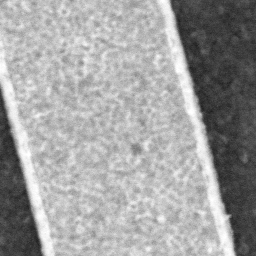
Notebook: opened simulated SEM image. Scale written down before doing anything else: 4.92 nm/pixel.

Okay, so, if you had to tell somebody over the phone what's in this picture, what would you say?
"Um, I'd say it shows one or a few lines or trenches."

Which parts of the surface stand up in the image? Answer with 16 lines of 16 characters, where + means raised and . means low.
++++++++++......
+++++++++++.....
+++++++++++.....
+++++++++++.....
+++++++++++.....
++++++++++++....
.+++++++++++....
.+++++++++++....
.+++++++++++....
.++++++++++++...
..+++++++++++...
..+++++++++++...
..+++++++++++...
..++++++++++++..
...+++++++++++..
...+++++++++++..